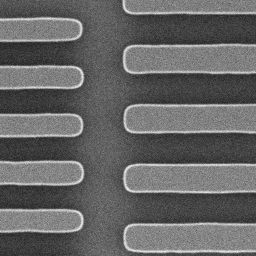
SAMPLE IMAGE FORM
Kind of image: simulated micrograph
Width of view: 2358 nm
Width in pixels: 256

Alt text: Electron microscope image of groups of lines, slits or small figures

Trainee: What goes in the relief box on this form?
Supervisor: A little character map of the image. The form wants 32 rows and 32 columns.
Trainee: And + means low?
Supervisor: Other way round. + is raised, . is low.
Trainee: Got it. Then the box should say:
................++++++++++++++++
................++++++++++++++++
+++++++++.......................
++++++++++......................
++++++++++......................
................................
................++++++++++++++++
................++++++++++++++++
++++++++++......++++++++++++++++
++++++++++......................
++++++++++......................
................................
................................
................++++++++++++++++
++++++++++......++++++++++++++++
++++++++++......++++++++++++++++
++++++++++......+++++++++.....++
................................
................................
................................
++++++++++......................
++++++++++......++++++++++++++++
++++++++++......++++++++++++++++
................++++++++++++++++
................................
................................
++++++++++......................
++++++++++......................
++++++++++......++++++++++++++++
................++++++++++++++++
................++++++++++++++++
................................